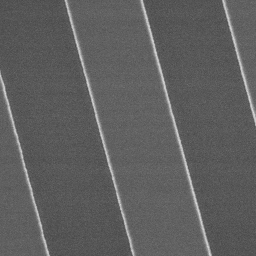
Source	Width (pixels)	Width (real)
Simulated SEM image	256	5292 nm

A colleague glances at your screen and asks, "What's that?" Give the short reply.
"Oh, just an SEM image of lines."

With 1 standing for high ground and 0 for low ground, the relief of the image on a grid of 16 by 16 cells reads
0000111110000011
0000111110000011
0000011111000001
0000011111000001
0000011111000001
0000001111000001
1000001111100000
1000001111100000
1000001111100000
1000000111100000
1100000111110000
1100000111110000
1100000111110000
1100000011111000
1110000011111000
1110000011111000